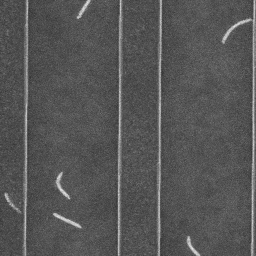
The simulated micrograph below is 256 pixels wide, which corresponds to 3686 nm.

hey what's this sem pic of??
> wiring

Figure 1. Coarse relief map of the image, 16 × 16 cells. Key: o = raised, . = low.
oo.....ooo......
oo.....ooo......
oo.....ooo......
oo.....ooo......
oo.....ooo......
oo.....ooo......
oo.....ooo......
oo.....ooo......
oo.....ooo......
oo.....ooo......
oo.....ooo......
oo.....ooo......
oo.....ooo......
oo.....ooo......
oo.....ooo......
oo.....ooo......